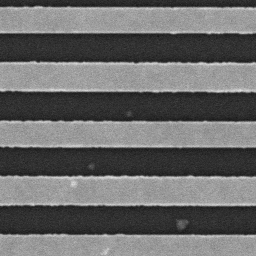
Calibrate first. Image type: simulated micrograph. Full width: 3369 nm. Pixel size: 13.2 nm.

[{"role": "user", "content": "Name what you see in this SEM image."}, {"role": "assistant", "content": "lines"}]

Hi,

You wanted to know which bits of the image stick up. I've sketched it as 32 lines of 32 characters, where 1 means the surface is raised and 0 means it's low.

00000000000000000000000000000000
11111111111111111111111111111111
11111111111111111111111111111111
11111111111111111111111111111111
00000000000000000000000000000000
00000000000000000000000000000000
00000000000000000000000000000000
00000000000000000000000000000000
11111111111111111111111111111111
11111111111111111111111111111111
11111111111111111111111111111111
00000000000000000000000000000000
00000000000000000000000000000000
00000000000000000000000000000000
00000000000000000000000000000000
11111111111111111111111111111111
11111111111111111111111111111111
11111111111111111111111111111111
00000000000000000000000000000000
00000000000000000000000000000000
00000000000000000000000000000000
00000000000000000000000000000000
11111111111111111111111111111111
11111111111111111111111111111111
11111111111111111111111111111111
11111111111111111111111111111111
00000000000000000000000000000000
00000000000000000000000000000000
00000000000000000000000000000000
11111111111111111111111111111111
11111111111111111111111111111111
11111111111111111111111111111111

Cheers